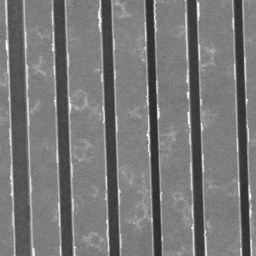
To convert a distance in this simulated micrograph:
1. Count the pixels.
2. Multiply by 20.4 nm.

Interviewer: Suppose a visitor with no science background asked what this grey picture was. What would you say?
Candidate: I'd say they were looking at parallel lines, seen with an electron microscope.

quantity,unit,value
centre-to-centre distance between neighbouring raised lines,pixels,44.2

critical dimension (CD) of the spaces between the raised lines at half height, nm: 212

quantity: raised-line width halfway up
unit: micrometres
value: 0.694